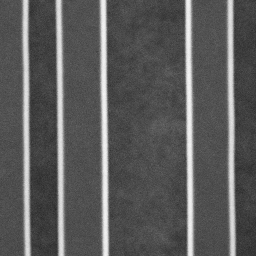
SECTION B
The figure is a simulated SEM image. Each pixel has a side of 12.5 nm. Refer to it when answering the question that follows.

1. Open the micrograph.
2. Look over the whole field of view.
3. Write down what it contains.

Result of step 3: groups of lines, slits or small figures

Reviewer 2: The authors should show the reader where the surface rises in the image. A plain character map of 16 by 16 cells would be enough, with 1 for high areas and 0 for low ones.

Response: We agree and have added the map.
1100110000001100
1100110000001100
1100110000001100
1100110000001100
1100110000001100
1100110000001100
1100110000001100
1100111000001100
1100111000001100
1100111000001100
1100111000001100
1100111000001100
1100111000001110
1100111000001110
1100111000001110
1100111000001110